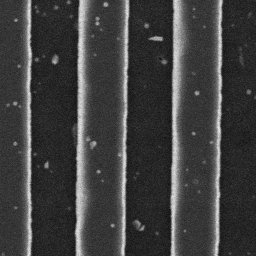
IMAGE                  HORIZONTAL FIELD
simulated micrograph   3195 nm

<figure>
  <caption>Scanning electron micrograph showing lines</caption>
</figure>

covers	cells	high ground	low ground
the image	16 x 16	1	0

1100011100011100
1100011100011100
1100011100011100
1100011100011100
1100011100011100
1100011100011100
1100011100011100
1100011100011100
1100011100011100
1100011100011100
1100011100011100
1100011100011100
1100011100011100
1100011100011100
1100011100011100
1100011100011100